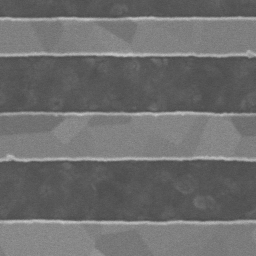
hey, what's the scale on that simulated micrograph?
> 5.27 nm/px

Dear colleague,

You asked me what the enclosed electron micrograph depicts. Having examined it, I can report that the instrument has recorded one or a few lines or trenches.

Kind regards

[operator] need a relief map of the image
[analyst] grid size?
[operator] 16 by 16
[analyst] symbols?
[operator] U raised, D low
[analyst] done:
DDDDDDDDDDDDDDDD
UUUUUUUUUUUUUUUU
UUUUUUUUUUUUUUUU
DDDDDDDDDDDDDDDU
DDDDDDDDDDDDDDDD
DDDDDDDDDDDDDDDD
DDDDDDDDDDDDDDDD
UUUUUUUUUUUUUUUU
UUUUUUUUUUUUUUUU
UUUUUUUUUUUUUUUU
DDDDDDDDDDDDDDDD
DDDDDDDDDDDDDDDD
DDDDDDDDDDDDDDDD
DDDDDDDDDDDDDDDD
UUUUUUUUUUUUUUUU
UUUUUUUUUUUUUUUU